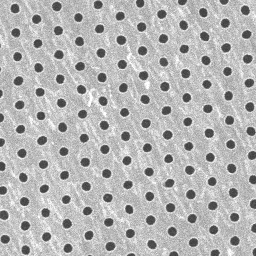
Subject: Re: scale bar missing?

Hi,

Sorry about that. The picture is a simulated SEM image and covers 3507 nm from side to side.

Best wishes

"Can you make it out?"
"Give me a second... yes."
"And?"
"a regular array of holes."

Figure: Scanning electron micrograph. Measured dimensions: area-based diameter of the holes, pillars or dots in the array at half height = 9.71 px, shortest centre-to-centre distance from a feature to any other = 326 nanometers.